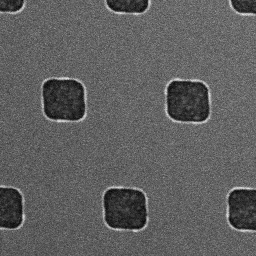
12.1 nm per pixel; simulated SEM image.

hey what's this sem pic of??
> holes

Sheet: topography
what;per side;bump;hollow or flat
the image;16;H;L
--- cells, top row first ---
LHHHHHHLLHHHHHHL
HHHHHHHHHHHHHHHH
HHHHHHHHHHHHHHHH
HHHHHHHHHHHHHHHH
HHHHHHHHHHHHHHHH
HHHLLHHHHHLLLHHH
HHHLLHHHHHLLLHHH
HHHHLHHHHHHLLHHH
HHHHHHHHHHHHHHHH
HHHHHHHHHHHHHHHH
HHHHHHHHHHHHHHHH
HHHHHHHHHHHHHHHH
LHHHHHHLLHHHHHLL
LHHHHHHLLHHHHHLL
HHHHHHHHHHHHHHHH
HHHHHHHHHHHHHHHH